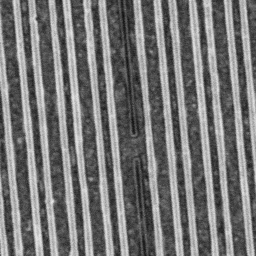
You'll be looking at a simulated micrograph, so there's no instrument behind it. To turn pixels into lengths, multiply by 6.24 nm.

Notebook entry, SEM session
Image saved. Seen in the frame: parallel lines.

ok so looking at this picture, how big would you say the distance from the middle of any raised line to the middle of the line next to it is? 0.109 µm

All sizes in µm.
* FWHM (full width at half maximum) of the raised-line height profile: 0.0334